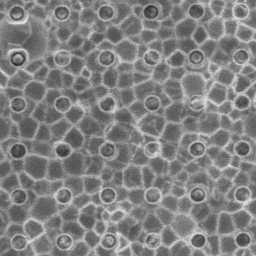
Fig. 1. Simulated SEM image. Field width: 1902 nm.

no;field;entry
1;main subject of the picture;a regular array of holes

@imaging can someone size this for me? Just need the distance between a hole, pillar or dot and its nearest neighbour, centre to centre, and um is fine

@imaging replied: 0.207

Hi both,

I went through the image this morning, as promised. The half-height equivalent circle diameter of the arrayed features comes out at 114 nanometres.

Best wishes